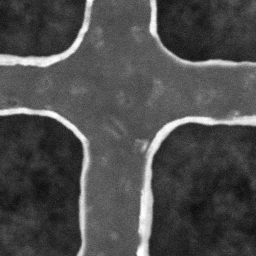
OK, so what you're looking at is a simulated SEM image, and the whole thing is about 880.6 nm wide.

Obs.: holes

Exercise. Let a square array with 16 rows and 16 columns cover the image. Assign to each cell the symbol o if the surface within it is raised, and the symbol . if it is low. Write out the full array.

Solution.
.....ooooo......
.....ooooo......
.....ooooo......
...oooooooo.....
oooooooooooooooo
oooooooooooooooo
oooooooooooooooo
....oooooooooooo
.....ooooo......
.....ooooo......
.....oooo.......
.....oooo.......
.....oooo.......
.....oooo.......
.....oooo.......
.....oooo.......